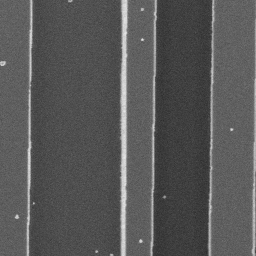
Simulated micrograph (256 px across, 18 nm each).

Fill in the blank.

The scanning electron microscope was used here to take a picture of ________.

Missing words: lines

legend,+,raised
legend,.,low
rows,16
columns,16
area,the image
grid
++......++...+++
++......++...+++
++......++...+++
++......++...+++
++......++...+++
++......++...+++
++......++...+++
++......++...+++
++......++...+++
++......++...+++
++......++...+++
++......++...+++
++......++...+++
++......+....+++
++......+....+++
++......+....+++